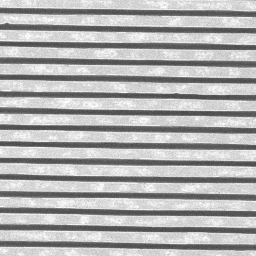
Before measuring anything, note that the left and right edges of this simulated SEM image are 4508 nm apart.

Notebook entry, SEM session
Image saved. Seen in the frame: parallel lines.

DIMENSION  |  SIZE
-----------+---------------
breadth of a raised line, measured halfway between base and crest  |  200 nm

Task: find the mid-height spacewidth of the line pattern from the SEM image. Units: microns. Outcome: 0.0924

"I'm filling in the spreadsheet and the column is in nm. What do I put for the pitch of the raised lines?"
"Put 293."